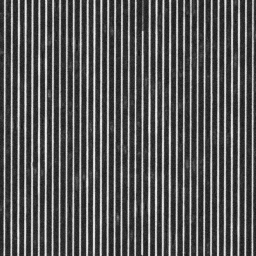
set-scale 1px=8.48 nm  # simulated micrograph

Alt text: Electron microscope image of parallel lines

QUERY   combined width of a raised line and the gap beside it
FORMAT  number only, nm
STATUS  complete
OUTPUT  58.4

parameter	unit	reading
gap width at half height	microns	0.0477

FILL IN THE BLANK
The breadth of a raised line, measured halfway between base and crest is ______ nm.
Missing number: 13.8